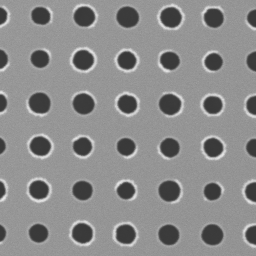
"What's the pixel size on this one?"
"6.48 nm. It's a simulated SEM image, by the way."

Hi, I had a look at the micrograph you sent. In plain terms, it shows a regular array of holes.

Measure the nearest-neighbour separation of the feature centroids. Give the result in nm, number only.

279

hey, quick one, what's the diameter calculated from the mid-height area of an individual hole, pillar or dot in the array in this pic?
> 124 nm